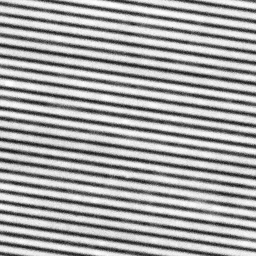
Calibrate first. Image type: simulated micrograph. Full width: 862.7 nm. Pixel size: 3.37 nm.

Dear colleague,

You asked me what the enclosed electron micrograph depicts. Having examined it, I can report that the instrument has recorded parallel lines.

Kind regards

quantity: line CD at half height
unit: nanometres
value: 17.9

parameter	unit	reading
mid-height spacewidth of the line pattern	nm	15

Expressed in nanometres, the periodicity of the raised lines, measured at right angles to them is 34.7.